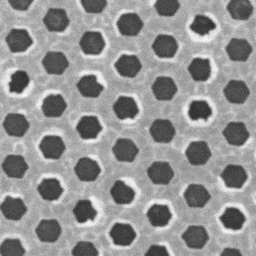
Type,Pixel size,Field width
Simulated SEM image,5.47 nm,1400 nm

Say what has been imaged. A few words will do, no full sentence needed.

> a regular array of holes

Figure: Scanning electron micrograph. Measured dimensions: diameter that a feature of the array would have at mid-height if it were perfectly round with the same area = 0.142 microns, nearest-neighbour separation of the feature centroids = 41.2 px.